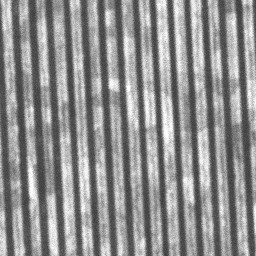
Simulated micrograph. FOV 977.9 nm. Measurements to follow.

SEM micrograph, parallel lines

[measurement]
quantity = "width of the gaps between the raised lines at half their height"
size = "29.6 nm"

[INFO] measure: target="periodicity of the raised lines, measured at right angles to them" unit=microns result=0.0658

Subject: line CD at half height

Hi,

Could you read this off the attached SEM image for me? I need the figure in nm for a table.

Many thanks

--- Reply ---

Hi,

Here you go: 36.8